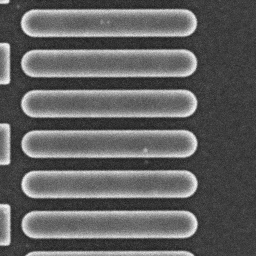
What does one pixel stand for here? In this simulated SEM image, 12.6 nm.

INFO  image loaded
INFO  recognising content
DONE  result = groups of lines, slits or small figures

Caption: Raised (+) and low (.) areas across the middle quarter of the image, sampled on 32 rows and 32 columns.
++++++++++++++++++++++++++++++++
++++++++++++++++++++++++++++++++
++++++++++++++++++++++++++++++++
................................
................................
................................
................................
++++++++++++++++++++++++++++++++
++++++++++++++++++++++++++++++++
++++++++++++++++++++++++++++++++
++++++++++++++++++++++++++++++++
++++++++++++++++++++++++++++++++
++++++++++++++++++++++++++++++++
................................
................................
................................
................................
++++++++++++++++++++++++++++++++
++++++++++++++++++++++++++++++++
++++++++++++++++++++++++++++++++
++++++++++++++++++++++++++++++++
++++++++++++++++++++++++++++++++
++++++++++++++++++++++++++++++++
................................
................................
................................
................................
++++++++++++++++++++++++++++++++
++++++++++++++++++++++++++++++++
++++++++++++++++++++++++++++++++
++++++++++++++++++++++++++++++++
++++++++++++++++++++++++++++++++